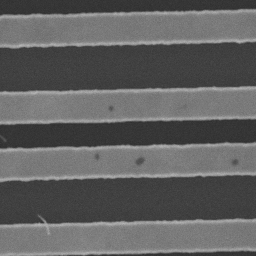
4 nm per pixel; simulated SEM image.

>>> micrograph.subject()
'lines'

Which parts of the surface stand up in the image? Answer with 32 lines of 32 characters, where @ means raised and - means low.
--------------------------------
-------------------@@@@@@@@@@@@@
@@@@@@@@@@@@@@@@@@@@@@@@@@@@@@@@
@@@@@@@@@@@@@@@@@@@@@@@@@@@@@@@@
@@@@@@@@@@@@@@@@@@@@@@@@@@@@@@@@
@@@@@@@@@@@@@@@@@@@@@@----------
--------------------------------
--------------------------------
--------------------------------
--------------------------------
--------------------------------
@--@@@@@@@@@@@@@@@@@@@@@@@@@@@@@
@@@@@@@@@@@@@@@@@@@@@@@@@@@@@@@@
@@@@@@@@@@@@@@@@@@@@@@@@@@@@@@@@
@@@@@@@@@@@@@@@@@@@@@@@@@@@@@@@@
@@------------------------------
--------------------------------
--------------------------------
-@@-@@@@@@@@@@@@@@@@@@@@@@@@@@@@
@@@@@@@@@@@@@@@@@@@@@@@@@@@@@@@@
@@@@@@@@@@@@@@@@@@@@@@@@@@@@@@@@
@@@@@@@@@@@@@@@@@@@@@@@@@@@@@@@@
@@@@@@@@------------------------
--------------------------------
--------------------------------
--------------------------------
--------------------------------
------------------------@@-@@@@@
@@@@@@@@@@@@@@@@@@@@@@@@@@@@@@@@
@@@@@@@@@@@@@@@@@@@@@@@@@@@@@@@@
@@@@@@@@@@@@@@@@@@@@@@@@@@@@@@@@
@@@@@@@@@@@@@@@@@@@@@@-@@-------